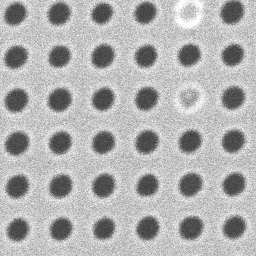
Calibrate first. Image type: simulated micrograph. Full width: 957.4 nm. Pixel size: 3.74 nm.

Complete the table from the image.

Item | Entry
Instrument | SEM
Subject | a regular array of holes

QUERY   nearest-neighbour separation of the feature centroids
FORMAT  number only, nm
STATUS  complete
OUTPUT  160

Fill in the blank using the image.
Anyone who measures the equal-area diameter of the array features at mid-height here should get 24.3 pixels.